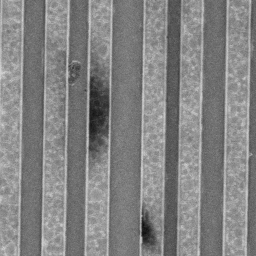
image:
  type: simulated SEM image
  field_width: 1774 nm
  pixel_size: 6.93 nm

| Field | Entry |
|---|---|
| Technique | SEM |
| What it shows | parallel lines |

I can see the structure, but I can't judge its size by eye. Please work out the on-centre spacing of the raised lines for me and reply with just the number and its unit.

314 nm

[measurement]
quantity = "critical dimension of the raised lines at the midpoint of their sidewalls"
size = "158 nanometres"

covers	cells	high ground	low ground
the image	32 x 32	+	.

+++...+++..+++....+++..++...+++.
+++...+++..+++....+++..++...+++.
+++...+++..+++....+++..++...+++.
+++...+++..+++....+++..++...+++.
+++...+++..+++....+++..++...+++.
+++...+++..+++....+++..++...+++.
+++...++...+++....+++..++...+++.
+++...++...+++....+++..++...+++.
+++...++...+++....+++..++...+++.
+++...++...+++....+++..++...+++.
+++...++...+++....+++..++...+++.
+++...++...+++....+++..++...+++.
+++...++...+++....+++..++...+++.
+++...++...+++....+++..++...+++.
+++...++...+++....+++..++...+++.
+++...++...+++....+++.+++...+++.
+++...++...+++....+++.+++...+++.
+++...++...+++....+++.+++...+++.
+++...++...+++....+++.+++...+++.
+++...++...+++....+++.+++...+++.
+++...++...+++....+++.+++...+++.
+++..+++...+++....++..+++...+++.
+++..+++...+++....++..+++...+++.
++...+++...+++....++..+++...+++.
++...+++...+++....++..+++...+++.
++...+++...+++....++..+++...+++.
++...+++...+++....++..+++...+++.
++...+++...++.....++..+++...+++.
++...+++...++.....++..+++...+++.
++...+++...++.....++..+++...+++.
++...+++...++.....++..+++...+++.
++...+++...++.....++..+++...+++.